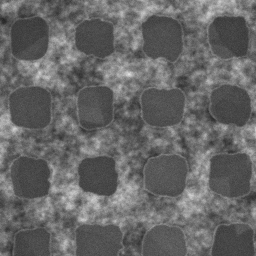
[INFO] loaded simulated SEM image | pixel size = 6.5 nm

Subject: a regular array of raised bodies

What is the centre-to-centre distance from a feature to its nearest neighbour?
428 nm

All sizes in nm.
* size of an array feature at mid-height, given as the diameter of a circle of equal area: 292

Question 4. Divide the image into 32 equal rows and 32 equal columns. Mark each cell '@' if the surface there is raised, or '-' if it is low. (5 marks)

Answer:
--------------------------------
--------------------------------
--@@@@-----@@-----@@@@-----@@@@-
-@@@@@---@@@@@----@@@@@---@@@@@-
-@@@@@---@@@@@----@@@@@---@@@@@-
-@@@@@---@@@@@----@@@@@---@@@@@-
-@@@@@----@@@@----@@@@@----@@@@-
--@@@----------------@----------
--------------------------------
--------------------------------
--------------------------------
--@@@@----@@@@----@@@@@---@@@@@-
-@@@@@----@@@@----@@@@@---@@@@@-
-@@@@@----@@@@----@@@@@---@@@@@-
-@@@@@----@@@@----@@@@@----@@@@-
--@@@@----@@@@----@@@@------@@@-
--------------------------------
--------------------------------
--------------------------------
------------@-------@@@----@@@@-
-@@@@@----@@@@----@@@@@---@@@@@@
-@@@@@@---@@@@@---@@@@@---@@@@@@
-@@@@@----@@@@@---@@@@@---@@@@@-
--@@@@----@@@@@---@@@@@---@@@@@-
--@@@@-------@------@@------@@--
--------------------------------
--------------------------------
--------------------------------
----@-----@@@@@----@@@-----@@@@@
--@@@@---@@@@@@---@@@@@----@@@@@
--@@@@---@@@@@@---@@@@@----@@@@@
--@@@@---@@@@@@---@@@@@---@@@@@@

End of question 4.